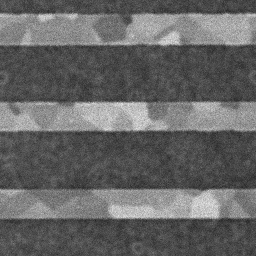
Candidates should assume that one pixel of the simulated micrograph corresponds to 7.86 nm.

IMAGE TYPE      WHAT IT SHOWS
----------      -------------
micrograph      one or a few lines or trenches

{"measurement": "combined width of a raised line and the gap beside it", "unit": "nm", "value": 686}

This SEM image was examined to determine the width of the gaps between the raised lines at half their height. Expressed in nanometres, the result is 459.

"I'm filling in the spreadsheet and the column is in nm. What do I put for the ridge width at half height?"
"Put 225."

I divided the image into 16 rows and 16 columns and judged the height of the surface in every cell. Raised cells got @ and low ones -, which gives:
----------------
@@@@@@@@@@@@@@@@
@@@@@@@@@@@@@@@@
----------------
----------------
----------------
@@@@@@@@@@@@@@@@
@@@@@@@@@@@@@@@@
----------------
----------------
----------------
----------------
@@@@@@@@@@@@@@@@
@@@@@@@@@@@@@@@@
----------------
----------------